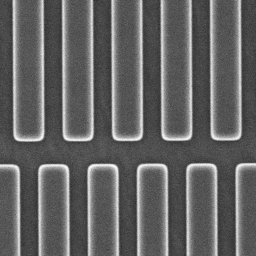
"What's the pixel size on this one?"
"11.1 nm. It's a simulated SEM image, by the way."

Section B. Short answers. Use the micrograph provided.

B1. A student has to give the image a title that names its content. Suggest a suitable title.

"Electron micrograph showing groups of lines, slits or small figures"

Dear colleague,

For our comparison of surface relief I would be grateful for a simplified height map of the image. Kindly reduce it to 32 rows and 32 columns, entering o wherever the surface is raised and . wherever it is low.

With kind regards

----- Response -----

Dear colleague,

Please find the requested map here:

..ooo...ooo...oooo..oooo..oooo..
..ooo...ooo...oooo..oooo..oooo..
..ooo...ooo...oooo..oooo..oooo..
..ooo...ooo...oooo..oooo..oooo..
..ooo...ooo...oooo..oooo..oooo..
..ooo...ooo...oooo..oooo..oooo..
..ooo...ooo...oooo..oooo..oooo..
..ooo...ooo...oooo..oooo..oooo..
..ooo...ooo...oooo..oooo..oooo..
..ooo...ooo...oooo..oooo..oooo..
..ooo...oooo..oooo..oooo..oooo..
..ooo...oooo..oooo..oooo..oooo..
..ooo...oooo..oooo..oooo..oooo..
..ooo...oooo..oooo..oooo...ooo..
..ooo...oooo..oooo..oooo...ooo..
..ooo...oooo..oooo..oooo...ooo..
..ooo...oooo..oooo..oooo...ooo..
..ooo....oo.....................
................................
................................
................................
oo...ooo...oooo..oooo..oooo...oo
oo...ooo...oooo..oooo..oooo...oo
oo...oooo..oooo..oooo..oooo...oo
oo...oooo..oooo..oooo..oooo...oo
oo...oooo..oooo..oooo..oooo...oo
oo...oooo..oooo..oooo...ooo...oo
oo...oooo..oooo..oooo...ooo...oo
oo...oooo..oooo..oooo...ooo...oo
oo...oooo..oooo..oooo...ooo...oo
oo...oooo..oooo..oooo...ooo...oo
oo...oooo..oooo..oooo...ooo...oo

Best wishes